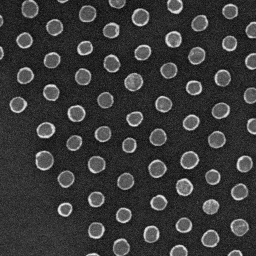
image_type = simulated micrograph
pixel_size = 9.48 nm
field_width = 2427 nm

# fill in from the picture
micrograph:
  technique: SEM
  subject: a regular array of raised bodies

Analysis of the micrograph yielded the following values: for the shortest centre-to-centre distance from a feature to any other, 284 nanometres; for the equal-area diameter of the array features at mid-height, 151 nanometres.